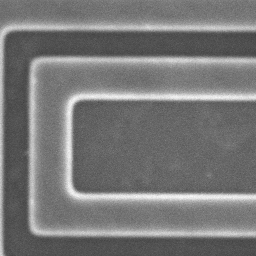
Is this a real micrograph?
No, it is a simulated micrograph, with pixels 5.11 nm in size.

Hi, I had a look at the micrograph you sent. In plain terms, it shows groups of lines, slits or small figures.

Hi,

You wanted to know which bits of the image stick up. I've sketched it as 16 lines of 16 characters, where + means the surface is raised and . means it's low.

++++++++++++++++
++++++++++++++++
................
................
..++++++++++++++
..++++++++++++++
..+++...........
..++............
..++............
..++............
..++............
..++............
..++++++++++++++
..++++++++++++++
..++++++++++++++
................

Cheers